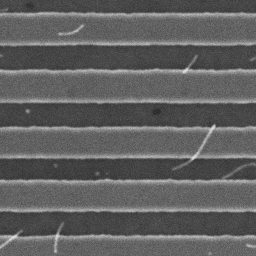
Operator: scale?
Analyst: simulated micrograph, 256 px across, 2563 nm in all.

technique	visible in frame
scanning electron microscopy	lines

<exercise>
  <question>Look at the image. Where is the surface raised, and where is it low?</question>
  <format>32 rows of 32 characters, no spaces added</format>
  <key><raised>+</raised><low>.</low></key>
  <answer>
................................
................................
++++++++++++++++++++++++++++++++
++++++++++++++++++++++++++++++++
++++++++++++++++++++++++++++++++
++++++++++..+++++++.++++++++++++
................................
................................
................................
++++++++++++++++++++++++++++++++
++++++++++++++++++++++++++++++++
++++++++++++++++++++++++++++++++
++++++++++++++++++++++++++++++++
................................
................................
................................
++++++++++++++++++++++++++++++++
++++++++++++++++++++++++++++++++
++++++++++++++++++++++++++++++++
++++++++++++++++++++++++++++++++
................................
................................
.............+..................
++++++++++++++++++++++++++++++++
++++++++++++++++++++++++++++++++
++++++++++++++++++++++++++++++++
................................
................................
................................
++....++++++++++++++++++++.++.++
++++++++++++++++++++++++++++++++
++++++++++++++++++++++++++++++++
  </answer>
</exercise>